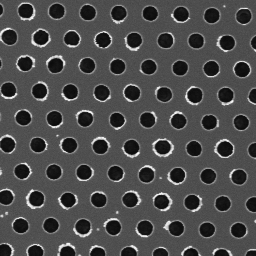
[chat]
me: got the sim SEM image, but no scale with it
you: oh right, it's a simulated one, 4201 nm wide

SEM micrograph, a regular array of holes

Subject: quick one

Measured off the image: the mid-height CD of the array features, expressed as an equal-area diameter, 250 nm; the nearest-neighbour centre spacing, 499 nanometres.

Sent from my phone